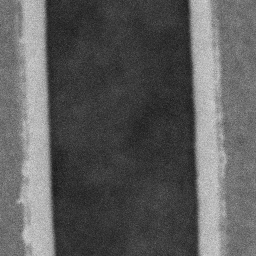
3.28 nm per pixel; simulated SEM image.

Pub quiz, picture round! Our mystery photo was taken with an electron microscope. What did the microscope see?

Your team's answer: one or a few lines or trenches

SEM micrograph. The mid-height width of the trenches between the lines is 0.566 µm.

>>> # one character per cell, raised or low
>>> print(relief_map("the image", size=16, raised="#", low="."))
##...........###
##...........###
##...........###
##...........###
##...........###
##...........###
##...........###
##...........###
##...........###
##...........###
##...........###
##...........###
##...........###
##...........###
##...........###
###..........###